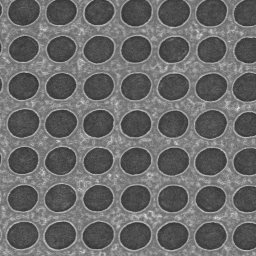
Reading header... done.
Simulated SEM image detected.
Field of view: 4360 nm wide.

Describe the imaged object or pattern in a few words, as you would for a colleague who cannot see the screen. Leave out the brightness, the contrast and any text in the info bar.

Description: a regular array of holes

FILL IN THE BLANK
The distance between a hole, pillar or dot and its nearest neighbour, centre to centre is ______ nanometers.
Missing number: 634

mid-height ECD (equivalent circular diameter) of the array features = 494 nm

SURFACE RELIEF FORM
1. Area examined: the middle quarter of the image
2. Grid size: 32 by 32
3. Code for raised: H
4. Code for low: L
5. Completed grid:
HHHHHHHHHHHHHHHHHHHHHHHHHHHHHHHH
HHHHHHHHHHHHHHHHHHHHHHHHHHHHHHHH
LHHHHHHHLLLHHHHHHLLLHHHHHHLLLHHH
LLHHHHLLLLLLHHHLLLLLLHHHHLLLLLHH
LLLHHLLLLLLLHHLLLLLLLLHHLLLLLLLH
LLLHHLLLLLLLHHLLLLLLLLHHLLLLLLLH
LLLHHLLLLLLLHHLLLLLLLHHLLLLLLLLH
LLHHHLLLLLLLHHHLLLLLLHHHLLLLLLLH
LHHHHHLLLLHHHHHHLLLLHHHHHLLLLLHH
HHHHHHHHHHHHHHHHHHHHHHHHHHHHHHHH
HHHHHHHHHHHHHHHHHHHHHHHHHHHHHHHH
LHHHHHHHLLHHHHHHHLLHHHHHHHHHHHHH
LLHHHHLLLLLLHHHHLLLLLHHHHLLLLLHH
LLLHHLLLLLLLHHHLLLLLLLHHLLLLLLLH
LLLHHLLLLLLLHHLLLLLLLLHHLLLLLLLH
LLLHHLLLLLLLHHLLLLLLLLHLLLLLLLLH
LLLHHLLLLLLLHHLLLLLLLHHHLLLLLLLH
LLHHHHLLLLLHHHHLLLLLHHHHLLLLLLHH
HHHHHHHHHHHHHHHHHHHHHHHHHHLLHHHH
HHHHHHHHHHHHHHHHHHHHHHHHHHHHHHHH
HHHHHHHHHHHHHHHHHHHHHHHHHHHHHHHH
LLHHHHHLLLLHHHHHLLLLLHHHHLLLLLHH
LLLHHHLLLLLLHHHLLLLLLLHHLLLLLLLH
LLLHHLLLLLLLHHLLLLLLLLHHLLLLLLLH
LLLHHLLLLLLLHHLLLLLLLLHLLLLLLLLH
LLLHHLLLLLLLHHLLLLLLLHHLLLLLLLLH
LLHHHHLLLLLHHHHLLLLLHHHHLLLLLLHH
LHHHHHHLLHHHHHHHHLLHHHHHHLLLLHHH
HHHHHHHHHHHHHHHHHHHHHHHHHHHHHHHH
HHHHHHHHHHHHHHHHHHHHHHHHHHHHHHHH
LLHHHHHLLLHHHHHHLLLLHHHHHHHLHHHH
LLLHHHLLLLLLHHHLLLLLLHHHHLLLLLHH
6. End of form